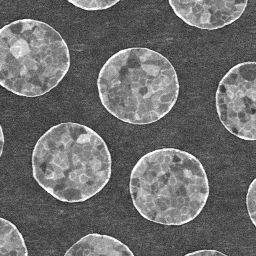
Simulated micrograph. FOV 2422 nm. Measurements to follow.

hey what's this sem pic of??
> raised bodies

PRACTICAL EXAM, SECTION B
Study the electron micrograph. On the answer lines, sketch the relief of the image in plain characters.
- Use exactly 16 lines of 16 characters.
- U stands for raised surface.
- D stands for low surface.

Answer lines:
DDDDDUUDDDDUUUUD
DUUDDDDDDDDDUUDD
UUUUDDDDDDDDDDDD
UUUUDDDUUUDDDDDD
UUUUDDUUUUUDDDUU
UUUDDDUUUUUDDDUU
DDDDDDUUUUUDDDUU
DDDDDDDDUUDDDDUU
DDDUUUDDDDDDDDDU
DDUUUUUDDDUUDDDD
DDUUUUUDUUUUUDDD
DDDUUUUDUUUUUDDD
DDDDUDDDUUUUUDDU
DDDDDDDDDUUUDDDD
UDDDDDDDDDDDDDDD
UUDDUUUUDDDDDDDD